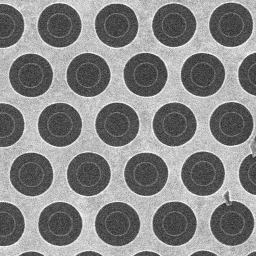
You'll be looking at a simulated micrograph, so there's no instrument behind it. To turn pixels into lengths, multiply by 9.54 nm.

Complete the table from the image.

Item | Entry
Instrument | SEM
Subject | an array of small figures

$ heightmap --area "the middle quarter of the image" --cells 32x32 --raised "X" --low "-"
X---XXXX---XXXX---XXXX----XXXX--
X--XXXXXX---XXX---XXXXX---XXX---
---XXXXXX---XXX---XXXXX---XXX---
---XXXXXX---XXX---XXXXX---XXX---
X---XXXXX--XXXX---XXXXX---XXX---
X----XX----XXXXX---XX----XXXXX--
XX--------XXXXXX---------XXXXXX-
XXX------XXXXXXXX------XXXXXXXXX
XXXXXXXXXXXXXXXXXXXXXXXXXXXXXXXX
XXXXXXXXXXXX--XXXXXXXXXXXXX-XXXX
--XXXXXXXX------XXXXXXXX-------X
---XXXXXX---------XXXXX---------
----XXXX----XXX---XXXXX---XXX---
X---XXXX---XXXXX---XXX---XXXXX--
XX---XXX--XXXXXX---XXX---XXXXXX-
XX---XXX--XXXXXX---XXX---XXXXXX-
XX--XXXX---XXXXX---XXX---XXXXX--
X---XXXX---XXXX---XXXXX---XXX---
----XXXXX---------XXXXX---------
---XXXXXXX-------XXXXXXX-------X
-XXXXXXXXXXX---XXXXXXXXXXX---XXX
XXXXXXXXXXXXXXXXXXXXXXXXXXXXXXXX
XXXX----XXXXXXXXXX-----XXXXXXXXX
XX--------XXXXXXX-------XXXXXXX-
XX---------XXXXX---------XXXXX--
X---XXXX---XXXX---XXXXX---XXXX--
X--XXXXXX---XXX---XXXXX---XXX---
---XXXXXX---XXX---XXXXX---XXX---
X--XXXXXX---XXX---XXXXX---XXX---
X---XXXXX--XXXX---XXXXX---XXXX--
X----X-----XXXXX---------XXXXX--
XX--------XXXXXXX--------XXXXXX-